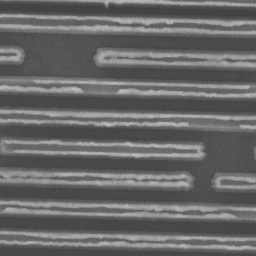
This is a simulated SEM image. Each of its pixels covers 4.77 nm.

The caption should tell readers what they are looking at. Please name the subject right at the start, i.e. parallel lines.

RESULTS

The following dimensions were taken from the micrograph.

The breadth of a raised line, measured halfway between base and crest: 71.5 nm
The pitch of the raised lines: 147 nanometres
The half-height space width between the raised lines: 71.5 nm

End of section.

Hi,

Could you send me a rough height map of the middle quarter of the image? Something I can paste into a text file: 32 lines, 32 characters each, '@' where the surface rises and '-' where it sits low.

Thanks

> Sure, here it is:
------------------------@@---@@@
--------------------------------
--------------------------------
--------------------------------
@@@@@@@@@@@@@@@@@@@@@-----------
@@@@@@@@@@@@@@@@@@@@@@@@@@@@@@@@
@@@@@@@@@@@@@@@@@@@@@@@@@@@@@@@@
-@@@@@@@@@@@@@@@@@@@@@@@@@@@@@@@
--------------------------------
--------------------------------
--------------------------------
--------------------------------
@@@@@@@@@@@@@@@@@@@@@@@@@@@@@@@-
@@@@@@@@@@@@@@@@@@@@@@@@@@@@@@@@
@@@@@@@@@@@@@@@@@@@@@@@@@@@@@@@@
---------@@@@@@@@@@@@@@@@@@@@@@@
--------------------------------
--------------------------------
--------------------------------
@@@@@@@@@@@@@-------------------
@@@@@@@@@@@@@@@@@@@@@@@@@@@@@@@@
@@@@@@@@@@@@@@@@@@@@@@@@@@@@@@@@
@@@@@@@@@@@@@@@@@@@@@@@@@@@@@@@@
-----------------------@--------
--------------------------------
--------------------------------
--------------------------------
@@@@@@@@@@@@@@@@@@@@@@@@-----@@-
@@@@@@@@@@@@@@@@@@@@@@@@@@@@@@@@
@@@@@@@@@@@@@@@@@@@@@@@@@@@@@@@@
----@@@@@@@@@@@@@@@@@@@@@@@@@@@@
--------------------------------